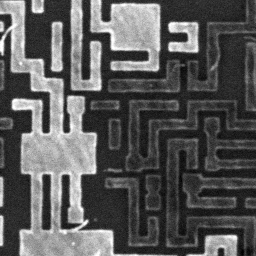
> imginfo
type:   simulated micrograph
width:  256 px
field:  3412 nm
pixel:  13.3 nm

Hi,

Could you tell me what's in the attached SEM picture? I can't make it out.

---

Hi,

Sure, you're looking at wiring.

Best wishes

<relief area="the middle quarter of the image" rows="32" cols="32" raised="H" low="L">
LLHHLLLHHLLLHHHHHHHHHHHHLLHHHLLH
LLHHLLLHHLLLLLLLLLLLLLHLLLHHHLLH
LLHHLLLHHLLLLLLLLLLLLLLLLLHHHLLH
LLHHLLLHHLLLLLLLLLLLLLLLLLHHHLLH
LLHHHHHHHLLHHHHHHHHHHHHHHHHHHLLH
LLHHHHHHHLLHHHHHHHHHHHHHHHHHHLLH
LLLLLLLLLLLHHHHHHHHHHHHHHHHHHLLL
LLLLLLLLLLLLLLLLLLLLLLLLLLLLLLLL
LHHHHLLLLLLLLLLLLLLLLLLLLLLLLLLL
LHHHHLLHHHHHHHLLLHHHHHHHHHHHLLLH
LHHHHLLHHHHHHHLLLHHHHHHHHHHHHLLH
LHHHHLLLLLLLLLLLLHHLLLLLLLLLLLLH
LHHHLLLLLLLLLLLLLHHLLLLLLLLLLLLH
LLHHLLLLLLLLLLLLLHHLLLLLLLLLLLLH
LLHHLLLLLLLHHHLLHHHLLHHHHHHHHHHH
LLHHLLLLLLLHHHLLHHHLLHHHHHHHHHHH
LLHHLLLLLLLHHHLLHHHLLHHHLLLLLLLL
LHHHHHHHLLLHHHLLHHHLLHHLLLLLLLLL
HHHHHHHHLLLHHHLLHHHLLHHLLLLLLLLL
HHHHHHHHLLLHHHLLHHHLLHHLLLHHHHHH
HHHHHHHHLLLHHHLLHHHLLHHLLLHHHHHH
HHHHHHHHLLLLLLLLHHHLLHHLLLHHHLHH
HHHHHHHHLLLLLLLLHHHLLHHHLLHHHLLH
HHHHHHHHLLLLLLLLHHHHLHHHLLHHHLLH
HHHHHHHHLLLLLLLLHHHHHHHHLLHHHLLH
HHHHHHHHLLLLLLLLHHHHHHHHLLHHHLLH
HHHHHHHHLLLLLLLLHHHHLLLLLLHHHLLL
LHHHHLLLLLLLLLLLLLLLLLLLLLHHHLLL
LLHHLLLLLLLLLLLLLLLLLHHHLLHHHLHH
LLHHLLLLLLLHHHHHHHHLLHHHLLHHHLHH
LLHHLLLLLLLHHHHHHHHLLHHHLLHHLLHH
LLHHLLLLLLLLLLLLHHHLLHHHLLHHLLHH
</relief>